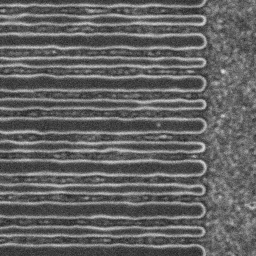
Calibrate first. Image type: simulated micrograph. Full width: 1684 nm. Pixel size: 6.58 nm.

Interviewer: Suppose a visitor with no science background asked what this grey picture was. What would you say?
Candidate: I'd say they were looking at groups of lines, slits or small figures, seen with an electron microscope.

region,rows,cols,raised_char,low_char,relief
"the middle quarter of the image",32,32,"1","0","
11111111111111011111111111111111
00000000000000000000000000000000
00000000000000000000000000000000
11111111111111111111111111111111
11111111111111111111111111111111
11111111111111111111111111111111
11111111000111111111111111101111
00000000000000000000000000000000
00000000000000000000000000000000
11111111111111111111111111111111
11111111111111111111111111111111
00000000000000000000000000000000
00000000000000000000000000000000
00000000000000000000000000000000
11111111111111111111111111111111
11111111111111111111111111111111
11111111111111111111111111111111
00000000000000000000000000000000
00000000000000000000000000000000
11000000000011111111111101111000
11111111111111111111111111111111
11111111111101111111111111111111
00000000000000000000000000000000
00000000000000000000000000000000
11111111111111111111111111111111
11111111111111111111111111111111
11111111111111111111111111111111
11111111111111111111111111111111
00000000000000000000000000000000
00000000000000000000000000000000
11111111111111111111111111111111
11111111111111111111111111111111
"